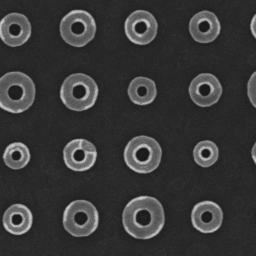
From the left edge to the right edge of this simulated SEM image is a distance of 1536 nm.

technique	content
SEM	a regular array of ring-shaped raised bodies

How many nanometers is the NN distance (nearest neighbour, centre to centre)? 378